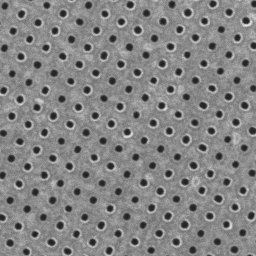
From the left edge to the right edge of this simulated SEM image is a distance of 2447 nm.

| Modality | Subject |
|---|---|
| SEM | a regular array of holes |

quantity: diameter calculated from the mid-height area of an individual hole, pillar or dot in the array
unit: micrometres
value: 0.0732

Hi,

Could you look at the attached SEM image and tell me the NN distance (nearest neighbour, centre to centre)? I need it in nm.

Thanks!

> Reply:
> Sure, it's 175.